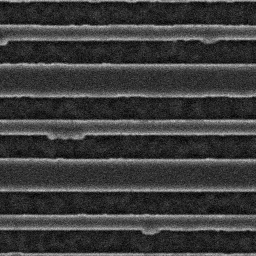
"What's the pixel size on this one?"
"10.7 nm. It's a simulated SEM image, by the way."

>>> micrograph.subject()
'lines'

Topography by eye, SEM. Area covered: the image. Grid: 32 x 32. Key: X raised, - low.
--------------------------------
--------------------------------
--------------------------------
XXXXXXXXXXXXXXXXXXXXXXXXXXXXXXXX
XXXXXXXXXXXXXXXXXXXXXXXXXXXXXXXX
--------------------------------
--------------------------------
--------------------------------
XXXXXXXXXXXXXXXXXXXXXXXXXXXXXXXX
XXXXXXXXXXXXXXXXXXXXXXXXXXXXXXXX
XXXXXXXXXXXXXXXXXXXXXXXXXXXXXXXX
XXXXXXXXXXXXXXXXXXXXXXXXXXXXXXXX
--------------------------------
--------------------------------
--------------------------------
XXXXXXXXXXXXXXXXXXXXXXXXXXXXXXXX
XXXXXXXXXXXXXXXXXXXXXXXXXXXXXXXX
--------------------------------
--------------------------------
--------------------------------
XXXXXXXXXXXXXXXXXXXXXXXXXXXXXXXX
XXXXXXXXXXXXXXXXXXXXXXXXXXXXXXXX
XXXXXXXXXXXXXXXXXXXXXXXXXXXXXXXX
XXXXXXXXXXXXXXXXXXXXXXXXXXXXXXXX
--------------------------------
--------------------------------
--------------------------------
XXXXXXXXXXXXXXXXXXXXXXXXXXXXXXXX
XXXXXXXXXXXXXXXXXXXXXXXXXXXXXXXX
--------------------------------
--------------------------------
--------------------------------